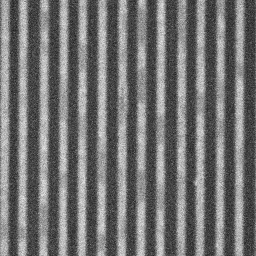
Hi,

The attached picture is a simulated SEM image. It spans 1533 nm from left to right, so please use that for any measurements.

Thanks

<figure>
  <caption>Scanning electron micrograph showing parallel lines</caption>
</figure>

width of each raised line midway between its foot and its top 33.7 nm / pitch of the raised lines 117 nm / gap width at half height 84.6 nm